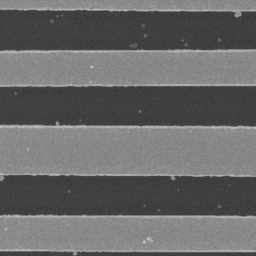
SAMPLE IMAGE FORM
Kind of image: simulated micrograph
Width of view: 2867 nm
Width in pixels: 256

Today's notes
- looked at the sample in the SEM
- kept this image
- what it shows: lines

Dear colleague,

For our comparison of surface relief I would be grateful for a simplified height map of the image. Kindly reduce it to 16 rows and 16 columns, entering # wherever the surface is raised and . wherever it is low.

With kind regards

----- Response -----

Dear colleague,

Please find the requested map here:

################
................
................
################
################
................
................
................
################
################
################
................
................
................
################
################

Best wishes